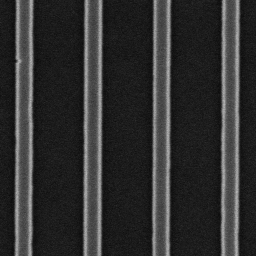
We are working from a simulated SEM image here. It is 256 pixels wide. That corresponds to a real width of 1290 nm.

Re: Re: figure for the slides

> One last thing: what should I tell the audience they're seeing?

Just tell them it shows one or a few lines or trenches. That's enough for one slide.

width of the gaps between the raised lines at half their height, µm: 0.275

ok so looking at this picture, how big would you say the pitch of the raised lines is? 0.346 microns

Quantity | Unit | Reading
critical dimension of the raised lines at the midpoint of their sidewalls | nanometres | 70.5